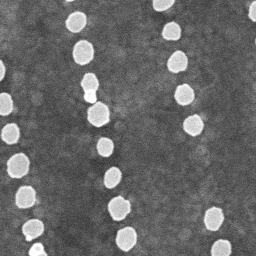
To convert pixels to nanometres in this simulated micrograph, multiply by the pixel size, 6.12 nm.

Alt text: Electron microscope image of a regular array of raised bodies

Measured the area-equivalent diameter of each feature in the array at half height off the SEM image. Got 20 px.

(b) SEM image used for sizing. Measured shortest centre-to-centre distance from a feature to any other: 192 nm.